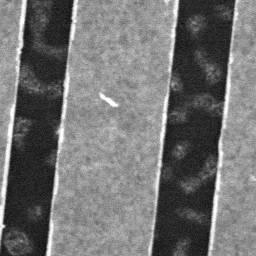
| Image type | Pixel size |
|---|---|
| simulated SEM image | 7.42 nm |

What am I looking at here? one or a few lines or trenches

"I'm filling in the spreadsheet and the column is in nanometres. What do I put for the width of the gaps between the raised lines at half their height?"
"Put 402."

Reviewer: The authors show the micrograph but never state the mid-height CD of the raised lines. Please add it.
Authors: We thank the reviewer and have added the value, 766 nanometres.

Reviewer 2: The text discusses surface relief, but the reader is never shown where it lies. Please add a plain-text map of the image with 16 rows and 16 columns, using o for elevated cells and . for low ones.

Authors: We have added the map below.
oo...oooooo....o
o...ooooooo....o
o...ooooooo...oo
o...ooooooo...oo
o...ooooooo...oo
o...ooooooo...oo
o...oooooo....oo
o...oooooo....oo
o...oooooo....oo
o...oooooo....oo
....oooooo....oo
...ooooooo....oo
...ooooooo...ooo
...ooooooo...ooo
...ooooooo...ooo
...oooooo....ooo